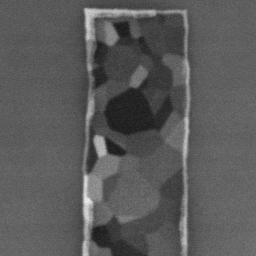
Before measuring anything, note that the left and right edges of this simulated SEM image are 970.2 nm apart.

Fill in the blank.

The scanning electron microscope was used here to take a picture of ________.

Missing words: one or a few lines or trenches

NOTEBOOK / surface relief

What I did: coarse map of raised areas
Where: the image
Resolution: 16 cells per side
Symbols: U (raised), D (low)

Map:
DDDDDDDDDDDDDDDD
DDDDDUUUUUUUDDDD
DDDDDUUUUUUUDDDD
DDDDDDUUUUUUDDDD
DDDDDDUUUUUUDDDD
DDDDDDUUUUUUDDDD
DDDDDDUUUUUUDDDD
DDDDDUUUUUUUDDDD
DDDDDUUUUUUUDDDD
DDDDDUUUUUUUDDDD
DDDDDUUUUUUUDDDD
DDDDDUUUUUUUDDDD
DDDDDUUUUUUUDDDD
DDDDDUUUUUUUDDDD
DDDDDUUUUUUUDDDD
DDDDDUUUUUUUDDDD